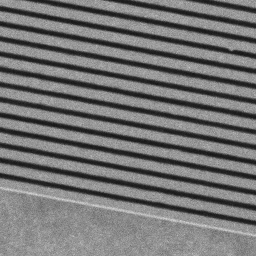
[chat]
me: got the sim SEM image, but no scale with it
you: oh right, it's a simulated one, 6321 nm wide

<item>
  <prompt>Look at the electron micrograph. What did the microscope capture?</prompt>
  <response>parallel lines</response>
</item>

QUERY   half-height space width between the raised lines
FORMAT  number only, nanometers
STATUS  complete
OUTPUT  124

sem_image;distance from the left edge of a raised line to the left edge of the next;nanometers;368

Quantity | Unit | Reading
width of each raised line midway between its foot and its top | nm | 249